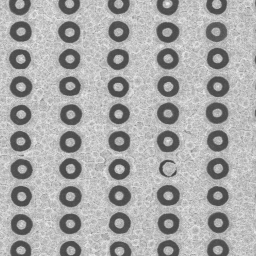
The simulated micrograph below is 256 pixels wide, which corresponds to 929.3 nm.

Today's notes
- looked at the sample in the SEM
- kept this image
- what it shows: a regular array of ring-shaped grooves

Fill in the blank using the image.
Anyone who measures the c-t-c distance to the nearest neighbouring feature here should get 98.4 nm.